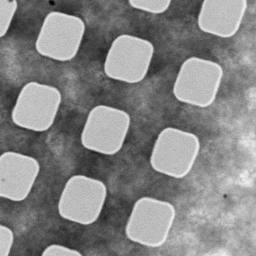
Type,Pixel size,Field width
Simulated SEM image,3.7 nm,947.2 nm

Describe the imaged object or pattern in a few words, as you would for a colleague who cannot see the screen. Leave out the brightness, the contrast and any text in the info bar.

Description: a regular array of raised bodies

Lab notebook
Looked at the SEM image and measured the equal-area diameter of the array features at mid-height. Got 0.174 um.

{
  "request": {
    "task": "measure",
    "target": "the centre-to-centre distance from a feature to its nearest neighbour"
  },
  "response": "267 nm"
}